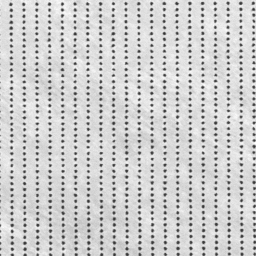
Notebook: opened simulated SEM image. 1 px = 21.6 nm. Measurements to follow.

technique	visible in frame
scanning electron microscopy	a regular array of holes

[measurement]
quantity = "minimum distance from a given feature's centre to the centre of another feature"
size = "128 nm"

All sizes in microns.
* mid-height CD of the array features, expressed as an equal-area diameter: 0.0733